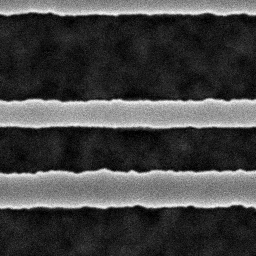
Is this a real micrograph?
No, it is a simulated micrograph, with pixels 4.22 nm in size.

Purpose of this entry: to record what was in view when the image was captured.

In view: lines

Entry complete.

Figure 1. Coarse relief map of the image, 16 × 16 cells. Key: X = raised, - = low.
XXXXXXXXXXXXXXXX
----------------
----------------
----------------
----------------
----------------
XXXXXXXXXXXXXXXX
XXXXXXXXXXXXXXXX
----------------
----------------
----------------
XXXXXXXXXXXXXXXX
XXXXXXXXXXXXXXXX
----------------
----------------
----------------